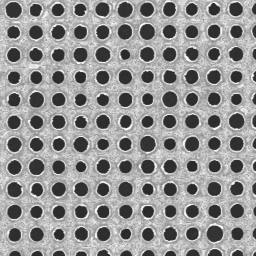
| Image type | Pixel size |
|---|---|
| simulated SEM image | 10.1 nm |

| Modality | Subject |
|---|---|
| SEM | a regular array of holes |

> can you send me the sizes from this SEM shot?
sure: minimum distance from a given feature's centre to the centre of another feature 0.223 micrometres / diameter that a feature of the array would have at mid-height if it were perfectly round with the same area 13.2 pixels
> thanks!